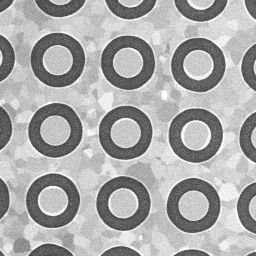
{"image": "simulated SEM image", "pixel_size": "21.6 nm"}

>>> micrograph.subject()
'an array of small figures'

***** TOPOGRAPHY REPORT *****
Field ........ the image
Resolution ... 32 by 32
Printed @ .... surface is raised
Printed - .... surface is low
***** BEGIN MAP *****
--@@@------@@------@@@------@@@-
@@@@@-----@@@@-----@@@------@@@-
@@@@@@@@@@@@@@@@@@@@@@@@--@@@@@@
@@@@@@@@@@@@@@@@@@@@@@@@@@@@@@@@
@@@@@----@@@@@@--@@@@@@@@@@@@@@@
-@@@------@@@------@@@@----@@@@@
--@@-------@@------@@@------@@@-
--@@-------@@------@@-------@@--
--@@-------@@------@@-------@@--
-@@@------@@@------@@@------@@--
@@@@@@---@@@@@----@@@@-----@@@@-
@@@@@@@@@@@@@@@@@@@@@@@@--@@@@@@
@@@@@@@@@@@@@@@@@@@@@@@@@@@@@@@@
@@@@@----@@@@@---@@@@@@@@@@@@@@@
-@@@------@@@-----@@@@-----@@@@-
-@@@------@@-------@@-------@@--
--@-------@@-------@@-------@@--
-@@@------@@-------@@-------@@--
@@@@------@@@------@@------@@@--
@@@@@@--@@@@@@----@@@@-----@@@@-
@@@@@@@@@@@@@@@@@@@@@@@@@@@@@@@@
@@@@@@@@@@@@@@@@@@@@@@@@@@@@@@@@
@@@@-----@@@@@---@@@@@@--@@@@@@@
-@@@------@@@-----@@@@-----@@@@-
-@@-------@@-------@@------@@@--
-@@-------@@-------@@-------@@--
-@@-------@@-------@@-------@@--
@@@@-----@@@@-----@@@------@@@--
@@@@@@-@@@@@@@---@@@@@----@@@@@-
@@@@@@@@@@@@@@@@@@@@@@@@@@@@@@@@
@@@@@--@@@@@@@@@@@@@@@@@@@@@@@@@
@@@@-----@@@@----@@@@@----@@@@@@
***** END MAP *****